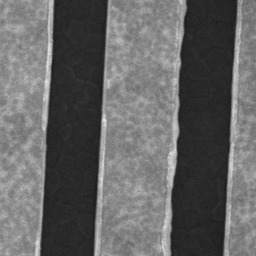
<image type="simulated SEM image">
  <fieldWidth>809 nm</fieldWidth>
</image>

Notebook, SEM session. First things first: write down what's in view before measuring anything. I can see one or a few lines or trenches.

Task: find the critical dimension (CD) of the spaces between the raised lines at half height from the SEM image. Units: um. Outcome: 0.173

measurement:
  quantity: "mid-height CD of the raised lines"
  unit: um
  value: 0.235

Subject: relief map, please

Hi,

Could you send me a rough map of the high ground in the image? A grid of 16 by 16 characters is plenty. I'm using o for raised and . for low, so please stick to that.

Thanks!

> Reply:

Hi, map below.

ooo....oooo....o
ooo....oooo....o
ooo....oooo....o
ooo....oooo....o
ooo....oooo....o
ooo...ooooo....o
ooo...ooooo....o
ooo...ooooo....o
ooo...ooooo...oo
ooo...ooooo...oo
ooo...ooooo...oo
ooo...ooooo...oo
ooo...ooooo...oo
ooo...ooooo...oo
ooo...oooo....oo
oo....oooo....oo